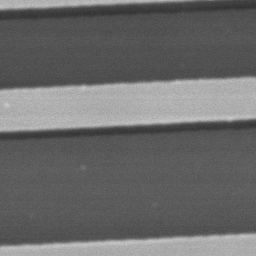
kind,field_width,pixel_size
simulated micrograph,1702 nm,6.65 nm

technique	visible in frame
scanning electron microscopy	lines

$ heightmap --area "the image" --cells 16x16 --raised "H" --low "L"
HHLLLLLLLLLLLLLL
LLLLLLLLLLLLLLLL
LLLLLLLLLLLLLLLL
LLLLLLLLLLLLLLLL
LLLLLLLLLLLLLLLL
LLLHHHHHHHHHHHHH
HHHHHHHHHHHHHHHH
HHHHHHHHHHHHHHLL
LLLLLLLLLLLLLLLL
LLLLLLLLLLLLLLLL
LLLLLLLLLLLLLLLL
LLLLLLLLLLLLLLLL
LLLLLLLLLLLLLLLL
LLLLLLLLLLLLLLLL
LLLLLLLLLLLLLLLL
HHHHHHHHHHHHHHHH